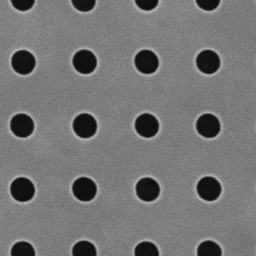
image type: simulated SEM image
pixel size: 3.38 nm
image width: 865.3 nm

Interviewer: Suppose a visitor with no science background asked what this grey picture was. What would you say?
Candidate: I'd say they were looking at a regular array of holes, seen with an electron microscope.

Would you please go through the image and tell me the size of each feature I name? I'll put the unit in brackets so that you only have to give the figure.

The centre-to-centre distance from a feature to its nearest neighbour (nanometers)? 208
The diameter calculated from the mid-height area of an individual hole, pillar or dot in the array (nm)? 81.3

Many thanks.